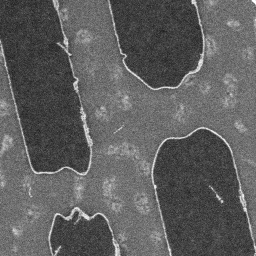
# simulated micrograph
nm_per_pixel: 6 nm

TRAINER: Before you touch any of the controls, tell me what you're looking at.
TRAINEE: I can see one or a few lines or trenches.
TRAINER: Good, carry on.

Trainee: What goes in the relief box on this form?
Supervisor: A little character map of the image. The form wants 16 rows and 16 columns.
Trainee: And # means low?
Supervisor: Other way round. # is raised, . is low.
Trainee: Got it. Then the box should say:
####...#####....
####...######...
####...######...
####....#####...
#####...####....
.####...........
.####...........
.####...........
.#####......##..
..####....####..
..###.....#####.
..........#####.
..........#####.
....##....#####.
...####...######
...####....#####